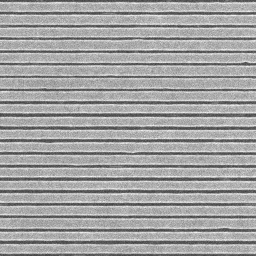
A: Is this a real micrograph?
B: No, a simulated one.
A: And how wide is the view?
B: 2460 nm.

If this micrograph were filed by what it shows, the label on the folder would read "parallel lines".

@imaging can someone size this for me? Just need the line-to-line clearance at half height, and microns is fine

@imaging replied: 0.0409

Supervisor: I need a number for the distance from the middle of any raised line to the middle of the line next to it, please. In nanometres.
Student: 122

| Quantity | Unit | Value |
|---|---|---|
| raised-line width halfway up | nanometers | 81.7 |